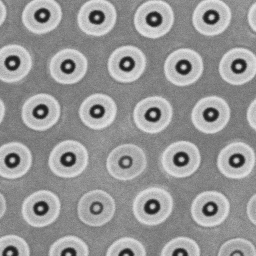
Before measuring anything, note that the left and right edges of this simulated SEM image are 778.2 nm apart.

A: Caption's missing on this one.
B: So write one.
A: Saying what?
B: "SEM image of a regular array of ring-shaped raised bodies with a dot in the middle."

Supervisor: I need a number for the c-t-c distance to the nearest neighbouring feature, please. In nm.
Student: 161